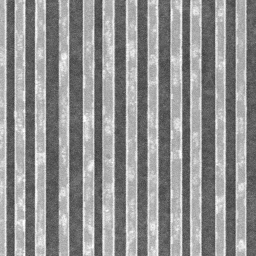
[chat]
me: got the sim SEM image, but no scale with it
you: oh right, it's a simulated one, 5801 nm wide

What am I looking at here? parallel lines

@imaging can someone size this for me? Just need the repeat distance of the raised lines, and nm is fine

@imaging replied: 501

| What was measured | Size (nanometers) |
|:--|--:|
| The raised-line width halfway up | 221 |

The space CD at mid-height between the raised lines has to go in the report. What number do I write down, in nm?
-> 263